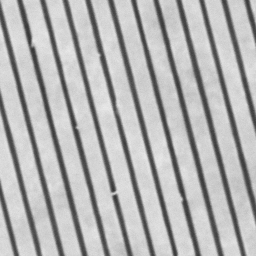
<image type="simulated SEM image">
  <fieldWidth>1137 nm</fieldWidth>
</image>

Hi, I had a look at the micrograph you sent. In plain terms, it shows parallel lines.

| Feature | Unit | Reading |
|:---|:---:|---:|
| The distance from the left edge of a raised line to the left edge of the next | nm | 97.6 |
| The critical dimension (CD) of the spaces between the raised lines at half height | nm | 24.7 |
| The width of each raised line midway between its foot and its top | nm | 73.6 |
